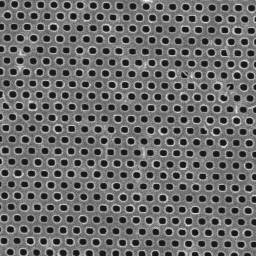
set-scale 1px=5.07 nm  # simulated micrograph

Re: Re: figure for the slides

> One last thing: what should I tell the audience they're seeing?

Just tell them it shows a regular array of holes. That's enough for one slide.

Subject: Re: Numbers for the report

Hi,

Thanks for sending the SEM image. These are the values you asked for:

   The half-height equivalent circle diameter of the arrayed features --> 33.9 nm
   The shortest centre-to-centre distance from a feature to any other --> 64.3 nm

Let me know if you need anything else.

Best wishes